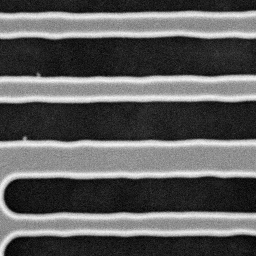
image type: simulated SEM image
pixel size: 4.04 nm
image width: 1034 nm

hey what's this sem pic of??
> groups of lines, slits or small figures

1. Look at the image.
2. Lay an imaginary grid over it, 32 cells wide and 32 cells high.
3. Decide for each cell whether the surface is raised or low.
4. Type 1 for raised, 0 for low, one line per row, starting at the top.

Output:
00000000000000000000000000000000
00000000000000000000000000000000
11111111111111111111111111111111
11111111111111111111111111111111
11000011000000000000000000000001
00000000000000000000000000000000
00000000000000000000000000000000
00000000000000000000000000000000
00000000000000000000000000000000
00000000000000000000000000000000
11111111111111111111111111111111
11111111111111111111111111111111
11110111111110000000000000000000
00000000000000000000000000000000
00000000000000000000000000000000
00000000000000000000000000000000
00000000000000000000000000000000
00000000000000000000000000000000
11111111111111111111111111111111
11111111111111111111111111111111
11111111111111111111111111111111
11111111111111111111111111111111
10000000000000000000000000000000
10000000000000000000000000000000
00000000000000000000000000000000
00000000000000000000000000000000
10000000000000000000000000000000
11111111111111111111111111111111
11111111111111111111111111111111
11000000000000000000000000000000
10000000000000000000000000000000
00000000000000000000000000000000